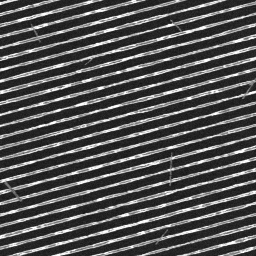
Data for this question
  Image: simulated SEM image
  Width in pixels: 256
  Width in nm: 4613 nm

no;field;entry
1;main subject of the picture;parallel lines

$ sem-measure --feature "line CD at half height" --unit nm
34.9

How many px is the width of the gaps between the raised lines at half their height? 8.34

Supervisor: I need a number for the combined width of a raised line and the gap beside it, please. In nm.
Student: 194